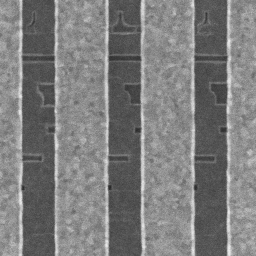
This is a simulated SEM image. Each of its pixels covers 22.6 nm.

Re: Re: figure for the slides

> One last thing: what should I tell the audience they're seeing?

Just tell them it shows wiring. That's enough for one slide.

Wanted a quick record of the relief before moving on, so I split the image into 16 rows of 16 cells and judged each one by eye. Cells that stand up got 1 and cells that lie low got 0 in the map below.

1000111001110011
1000111001110011
1000111001110011
1001111001110011
1000111001110011
1000111001110011
1000111001110011
1000111001110011
1000111001110011
1000111001110011
1000111001110011
1000111001110011
1000111001110011
1000111001110011
1000111001110011
1000111001110011